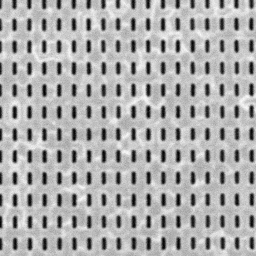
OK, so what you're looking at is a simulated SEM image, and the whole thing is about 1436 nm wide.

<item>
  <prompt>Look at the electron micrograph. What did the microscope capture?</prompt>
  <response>a regular array of holes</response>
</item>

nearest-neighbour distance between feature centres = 81.6 nm